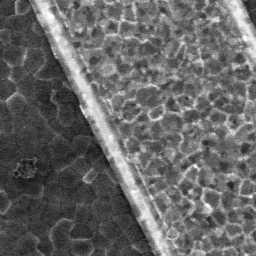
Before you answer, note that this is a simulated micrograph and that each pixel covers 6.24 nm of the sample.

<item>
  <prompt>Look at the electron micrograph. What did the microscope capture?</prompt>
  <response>one or a few lines or trenches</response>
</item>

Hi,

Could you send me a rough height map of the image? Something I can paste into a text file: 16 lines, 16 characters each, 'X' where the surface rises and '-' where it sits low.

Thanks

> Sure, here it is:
---XXXXXXXXXXXX-
---XXXXXXXXXXXX-
----XXXXXXXXXXXX
----XXXXXXXXXXXX
-----XXXXXXXXXXX
-----XXXXXXXXXXX
------XXXXXXXXXX
------XXXXXXXXXX
-------XXXXXXXXX
-------XXXXXXXXX
--------XXXXXXXX
--------XXXXXXXX
---------XXXXXXX
---------XXXXXXX
----------XXXXXX
----------XXXXXX